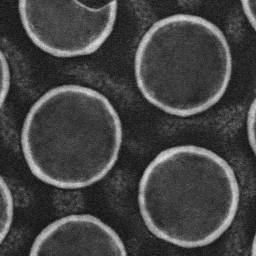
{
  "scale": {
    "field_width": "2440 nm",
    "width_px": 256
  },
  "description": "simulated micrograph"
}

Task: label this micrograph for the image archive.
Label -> raised bodies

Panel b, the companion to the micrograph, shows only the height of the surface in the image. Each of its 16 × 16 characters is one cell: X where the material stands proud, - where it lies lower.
-XXXXXX--------X
--XXXXX---XXX---
--XXXX---XXXXX--
---------XXXXX--
---------XXXXX--
----X----XXXXX--
--XXXXX---XXX---
--XXXXX---------
--XXXXX---------
--XXXXX----XX---
--XXXXX--XXXXX--
----X----XXXXXX-
X--------XXXXXX-
X--------XXXXX--
---XXXX---XXXX--
--XXXXXX--------